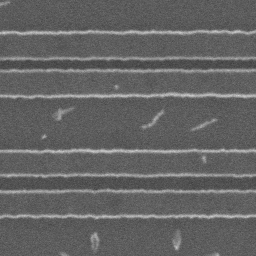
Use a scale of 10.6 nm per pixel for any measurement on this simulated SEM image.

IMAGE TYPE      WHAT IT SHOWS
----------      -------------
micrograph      lines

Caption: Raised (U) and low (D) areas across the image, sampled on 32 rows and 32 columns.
DDDDDDDDDDDDDDDDDDDDDDDDDDDDDDDD
DDDDDDDDDDDDDDDDDDDDDDDDDDDDDDDD
DDDDDDDDDDDDDDDDDDDDDDDDDDDDDDDD
DDDDDDDDDDDDDDDDDDDDDDDDDDDDDDDD
UUUUUUUUUUUUUUUUUUUUUUUUUUUUUUUU
UUUUUUUUUUUUUUUUUUUUUUUUUUUUUUUU
UUUUUUUUUUUUUUUUUUUUUUUUUUUUUUUU
DDDDDDDDDDDDDDDDDDDDDDDDDDDDDDDD
DDDDDDDDDDDDDDDDDDDDDDDDDDDDDDDD
UUUUUUUUUUUUUUUUUUUUUUUUUUUUUUUU
UUUUUUUUUUUUUUUUUUUUUUUUUUUUUUUU
UUUUUUUUUUUUUUUUUUUUUUUUUUUUUUUU
DDDDDDDDDDDDDDDDDDDDDDDDDDDDDDDD
DDDDDDDDDDDDDDDDDDDDDDDDDDDDDDDD
DDDDDDDDDDDDDDDDDDDDDDDDDDDDDDDD
DDDDDDDDDDDDDDDDDDDDDDDDDDDDDDDD
DDDDDDDDDDDDDDDDDDDDDDDDDDDDDDDD
DDDDDDDDDDDDDDDDDDDDDDDDDDDDDDDD
DDDDDDDDDDDDDDDDDDDDDDDDDDDDDDDD
UUUUUUUUUUUUUUUUUUUUUUUUUUUUUUUU
UUUUUUUUUUUUUUUUUUUUUUUUUUUUUUUU
UUUUUUUUUUUUUUUUUUUUUUUUUUUUUUUU
DDDDDDDDDDDDDDDDDDDDDDDDDDDDDDDD
DDDDDDDDDDDDDDDDDDDDDDDDDDDDDDDD
UUUUUUUUUUUUUUUUUUUUUUUUUUUUUUUU
UUUUUUUUUUUUUUUUUUUUUUUUUUUUUUUU
UUUUUUUUUUUUUUUUUUUUUUUUUUUUUUUU
DDDDDDDDDDDDDDDDDDDDDDDDDDDDDDDD
DDDDDDDDDDDDDDDDDDDDDDDDDDDDDDDD
DDDDDDDDDDDDDDDDDDDDDDDDDDDDDDDD
DDDDDDDDDDDDDDDDDDDDDDDDDDDDDDDD
DDDDDDDDDDDDDDDDDDDDDDDDDDDDDDDD